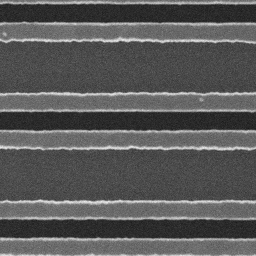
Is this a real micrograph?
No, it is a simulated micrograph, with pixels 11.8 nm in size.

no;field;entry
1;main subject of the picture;lines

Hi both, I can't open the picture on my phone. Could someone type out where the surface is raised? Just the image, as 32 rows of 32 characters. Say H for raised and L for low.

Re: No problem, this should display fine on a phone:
LLLLLLLLLLLLLLLLLLLLLLHLLLLLLLLL
LLLLLLLLLLLLLLLLLLLLLLLLLLLLLLLL
LLLLLLLLLLLLLLLLLLLLLLLLLLLLLLLL
HHHHHHHHHHHHHHHHHHHHHHHHHHHHHHHH
HHHHHHHHHHHHHHHHHHHHHHHHHHHHHHHH
LLLLLLLLLLLLLLLLLLLLLLLLLLLLLLLL
LLLLLLLLLLLLLLLLLLLLLLLLLLLLLLLL
LLLLLLLLLLLLLLLLLLLLLLLLLLLLLLLL
LLLLLLLLLLLLLLLLLLLLLLLLLLLLLLLL
LLLLLLLLLLLLLLLLLLLLLLLLLLLLLLLL
LLLLLLLLLLLLLLLLLLLLLLLLLLLLLLLL
LLLLLLLLLLLLLLLLLLLLLLLLLLLLLLLL
HHHHHHHHHHHHHHHHHHHHHHHHHHHHHHHH
HHHHHHHHHHHHHHHHHHHHHHHHHHHHHHHH
LLLLLLLLLLLLLLLLLLLLLLLLLLLLLLLL
LLLLLLLLLLLLLLLLLLLLLLLLLLLLLLLL
HHHHHHHHHHHHHHHHHHHHHHHHHHHHHHHH
HHHHHHHHHHHHHHHHHHHHHHHHHHHHHHHH
HHHHHHHHHHHHHHHHHHHHHHHHHHHHHHHH
LLLLLLLLLLLLLLLLLLLLLLLLLLLLLLLL
LLLLLLLLLLLLLLLLLLLLLLLLLLLLLLLL
LLLLLLLLLLLLLLLLLLLLLLLLLLLLLLLL
LLLLLLLLLLLLLLLLLLLLLLLLLLLLLLLL
LLLLLLLLLLLLLLLLLLLLLLLLLLLLLLLL
LLLLLLLLLLLLLLLLLLLLLLLLLLLLLLLL
HHHHHHHHHHHHHHHHHHHHHHHHHHHHHHHH
HHHHHHHHHHHHHHHHHHHHHHHHHHHHHHHH
LLLLLLLLLLLLLLLLLLLLLLLLLLLLLLLL
LLLLLLLLLLLLLLLLLLLLLLLLLLLLLLLL
LLLLLLLLLLLLLLLLLLLLLLLLLLLLLLLL
HHHHHHHHHHHHHHHHHHHHHHHHHHHHHHHH
HHHHHHHHHHHHHHHHHHHHHHHHHHHHHHHH